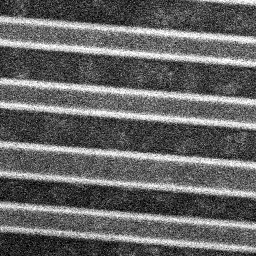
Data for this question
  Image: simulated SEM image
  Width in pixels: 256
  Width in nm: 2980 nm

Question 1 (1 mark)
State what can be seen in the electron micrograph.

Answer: parallel lines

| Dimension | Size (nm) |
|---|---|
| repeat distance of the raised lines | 717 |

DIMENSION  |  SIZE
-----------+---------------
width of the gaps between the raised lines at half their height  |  422 nm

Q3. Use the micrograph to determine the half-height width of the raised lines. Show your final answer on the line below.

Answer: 0.303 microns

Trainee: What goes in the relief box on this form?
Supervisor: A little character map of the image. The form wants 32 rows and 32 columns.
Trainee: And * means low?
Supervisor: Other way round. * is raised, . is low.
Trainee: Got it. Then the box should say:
................................
................................
**..............................
**************..................
**************************......
********************************
.............*******************
.........................*******
................................
................................
******..........................
******************..............
******************************..
...*****************************
...............*****************
...........................*****
................................
................................
*******.........................
*******************.............
*******************************.
********************************
........************************
....................************
................................
*...............................
*************...................
************************........
********************************
..........**********************
......................**********
................................